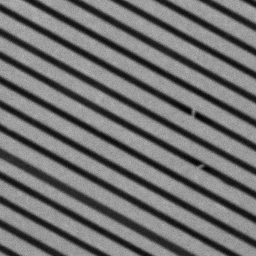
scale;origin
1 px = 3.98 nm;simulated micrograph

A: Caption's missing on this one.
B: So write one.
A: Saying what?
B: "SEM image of parallel lines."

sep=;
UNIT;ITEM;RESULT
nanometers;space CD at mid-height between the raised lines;27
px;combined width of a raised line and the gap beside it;21.1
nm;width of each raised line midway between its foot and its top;58.1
